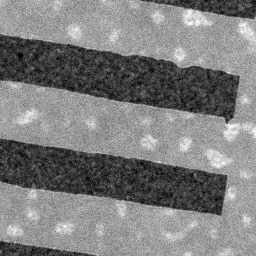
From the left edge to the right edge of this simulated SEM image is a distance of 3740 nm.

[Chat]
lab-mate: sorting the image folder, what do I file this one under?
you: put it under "one or a few lines or trenches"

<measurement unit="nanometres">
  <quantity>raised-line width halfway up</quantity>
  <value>665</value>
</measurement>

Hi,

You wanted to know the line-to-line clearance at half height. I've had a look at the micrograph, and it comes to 799 nm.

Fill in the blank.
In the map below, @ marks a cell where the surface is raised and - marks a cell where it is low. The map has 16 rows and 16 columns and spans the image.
-----------@@@@@
----------------
@@@-------------
@@@@@@@@@-------
@@@@@@@@@@@@@@--
---@@@@@@@@@@@@-
--------@@@@@@@-
----------------
----------------
@@@@@@----------
@@@@@@@@@@@@----
@@@@@@@@@@@@@@--
-------@@@@@@@--
----------------
----------------
@@@-------------